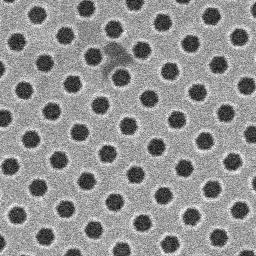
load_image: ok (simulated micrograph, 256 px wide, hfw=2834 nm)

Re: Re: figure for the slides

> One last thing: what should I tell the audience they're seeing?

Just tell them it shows a regular array of holes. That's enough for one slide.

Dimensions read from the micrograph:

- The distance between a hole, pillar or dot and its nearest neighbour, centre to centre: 0.38 micrometres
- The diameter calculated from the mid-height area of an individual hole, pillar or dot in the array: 0.215 um